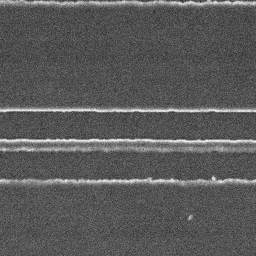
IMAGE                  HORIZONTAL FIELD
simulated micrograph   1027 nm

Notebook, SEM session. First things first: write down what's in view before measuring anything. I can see lines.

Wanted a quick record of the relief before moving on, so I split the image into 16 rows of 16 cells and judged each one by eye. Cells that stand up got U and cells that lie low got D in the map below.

UUUUUUUUUUUUUUUU
UUUUUUUUUUUUUUUU
UUUUUUUUUUUUUUUU
UUUUUUUUUUUUUUUU
UUUUUUUUUUUUUUUU
UUUUUUUUUUUUUUUU
UUUUUUUUUUUUUUUU
DDDDDDDDDDDDDDDD
DDDDDDDDDDDDDDDD
DDDDDDDDDDDDDDDD
DDDDDDDDDDDDDDDD
UUUUUUUUUUUUUUUU
UUUUUUUUUUUUUUUU
UUUUUUUUUUUUUUUU
UUUUUUUUUUUUUUUU
UUUUUUUUUUUUUUUU